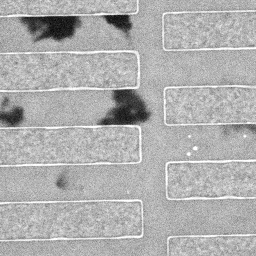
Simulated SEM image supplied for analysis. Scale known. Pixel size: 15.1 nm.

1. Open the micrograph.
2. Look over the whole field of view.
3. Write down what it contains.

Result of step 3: groups of lines, slits or small figures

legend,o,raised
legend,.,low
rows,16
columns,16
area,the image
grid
ooooooooo.......
..........oooooo
..........oooooo
oooooooo........
ooooooooo.......
oooooooo...ooooo
..........oooooo
..........oooooo
ooooooooo.......
ooooooooo.......
...........ooooo
..........oooooo
................
ooooooooo.......
ooooooooo.......
..........oooooo